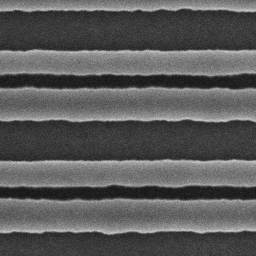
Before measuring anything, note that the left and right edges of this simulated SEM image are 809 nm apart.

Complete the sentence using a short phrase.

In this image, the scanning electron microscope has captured lines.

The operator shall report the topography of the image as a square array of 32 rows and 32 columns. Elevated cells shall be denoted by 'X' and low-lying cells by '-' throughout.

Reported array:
XXXXXXXXXXXXXXXXXXXXXXXXXXXXXXXX
--------------------------------
--------------------------------
--------------------------------
--------------------------------
--------------------------------
XXXXXXXXXXXXXXXXXXXXXXXXXXXXXXXX
XXXXXXXXXXXXXXXXXXXXXXXXXXXXXXXX
XXXXXXXXXXXXXXXXXXXXXXXXXXXXXXXX
--------------------------------
--------------------------------
XXXXXXXXXXXXXXXXXXXXXXXXXXXXXXXX
XXXXXXXXXXXXXXXXXXXXXXXXXXXXXXXX
XXXXXXXXXXXXXXXXXXXXXXXXXXXXXXXX
XXXXXXXXXXXXXXXXXXXXXXXXXXXXXXXX
--------------------------------
--------------------------------
--------------------------------
--------------------------------
--------------------------------
XXXXXXXXXXXXXXXXXXXXXXXXXXXXXXXX
XXXXXXXXXXXXXXXXXXXXXXXXXXXXXXXX
XXXXXXXXXXXXXXXXXXXXXXXXXXXXXXXX
--------------------------------
--------------------------------
XXXXXXXXXXXXXXXXXXXXXXXXXXXXXXXX
XXXXXXXXXXXXXXXXXXXXXXXXXXXXXXXX
XXXXXXXXXXXXXXXXXXXXXXXXXXXXXXXX
XXXXXXXXXXXXXXXXXXXXXXXXXXXXXXXX
--------------------------------
--------------------------------
--------------------------------